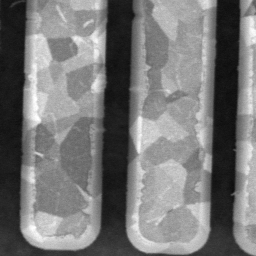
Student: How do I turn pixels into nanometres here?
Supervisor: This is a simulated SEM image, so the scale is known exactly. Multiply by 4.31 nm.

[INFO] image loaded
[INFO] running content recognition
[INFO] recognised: one or a few lines or trenches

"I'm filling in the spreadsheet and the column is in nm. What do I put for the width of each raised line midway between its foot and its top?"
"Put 312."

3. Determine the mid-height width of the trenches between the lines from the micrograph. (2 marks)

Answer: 150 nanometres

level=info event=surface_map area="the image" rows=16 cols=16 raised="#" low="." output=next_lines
..####...####..#
..####...####..#
..####...####..#
..####...####..#
..####..#####..#
..####..#####..#
..####..#####..#
..####..#####..#
..####..#####..#
..####..#####..#
..####..#####..#
..####..#####..#
..####..#####..#
..####..#####..#
..####..#####..#
.........###....